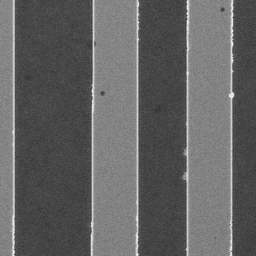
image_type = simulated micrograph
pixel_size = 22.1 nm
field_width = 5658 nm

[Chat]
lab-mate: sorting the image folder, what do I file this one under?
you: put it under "lines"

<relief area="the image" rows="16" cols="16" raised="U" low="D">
UDDDDDUUUDDDUUUD
UDDDDDUUUDDDUUUD
UDDDDDUUUDDDUUUD
UDDDDDUUUDDDUUUD
UDDDDDUUUDDDUUUD
UDDDDDUUUDDDUUUD
UDDDDDUUUDDDUUUD
UDDDDDUUUDDDUUDD
UDDDDDUUUDDDUUDD
UDDDDDUUUDDDUUDD
UDDDDDUUUDDDUUDD
UDDDDDUUUDDDUUDD
UDDDDDUUUDDDUUDD
UDDDDDUUUDDDUUDD
UDDDDDUUUDDDUUDD
UDDDDDUUUDDDUUDD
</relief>